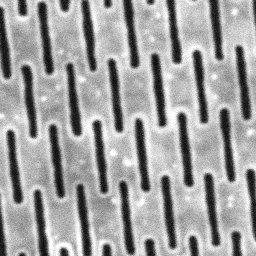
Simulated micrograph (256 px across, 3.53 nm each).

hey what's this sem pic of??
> a regular array of holes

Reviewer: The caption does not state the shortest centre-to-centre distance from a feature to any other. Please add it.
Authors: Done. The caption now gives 150 nm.